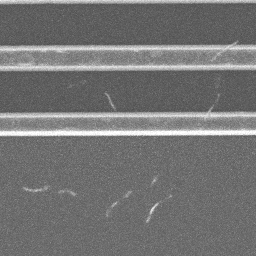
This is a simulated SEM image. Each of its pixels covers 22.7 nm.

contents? one or a few lines or trenches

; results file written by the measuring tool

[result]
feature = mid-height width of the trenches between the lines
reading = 1040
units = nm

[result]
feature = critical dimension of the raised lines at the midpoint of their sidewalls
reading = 453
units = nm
